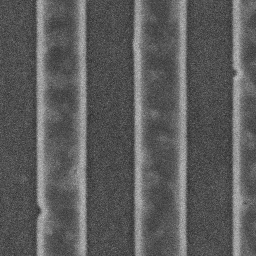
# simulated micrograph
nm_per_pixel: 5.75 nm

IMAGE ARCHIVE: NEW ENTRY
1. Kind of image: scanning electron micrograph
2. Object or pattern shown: one or a few lines or trenches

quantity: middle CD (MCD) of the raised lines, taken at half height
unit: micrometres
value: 0.259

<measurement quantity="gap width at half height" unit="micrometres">0.307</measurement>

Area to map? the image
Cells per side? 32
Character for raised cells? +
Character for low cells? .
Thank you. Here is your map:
.....+++++.......++++++.......++
.....+++++.......++++++.......++
.....+++++.......++++++.......++
.....+++++.......++++++.......++
.....+++++.......++++++.......++
.....+++++.......++++++.......++
.....+++++.......++++++.......++
.....+++++.......++++++.......++
.....+++++.......++++++.......++
.....+++++.......++++++.......++
.....+++++.......++++++.......++
.....+++++.......++++++.......++
.....+++++.......++++++.......++
.....+++++.......++++++.......++
.....+++++.......++++++.......++
.....+++++.......++++++......+++
.....+++++.......++++++......+++
.....+++++.......++++++.......++
.....+++++.......++++++......+++
.....+++++.......++++++......+++
.....+++++.......++++++......+++
.....+++++.......++++++.......++
.....+++++.......++++++.......++
.....+++++.......++++++.......++
.....+++++.......++++++.......++
.....+++++.......++++++.......++
.....+++++.......++++++.......++
.....+++++.......++++++.......++
.....+++++.......++++++.......++
.....+++++.......++++++.......++
.....+++++.......++++++.......++
.....+++++.......++++++.......++